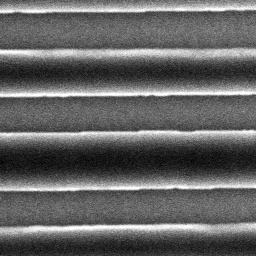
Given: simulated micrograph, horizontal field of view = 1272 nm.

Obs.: lines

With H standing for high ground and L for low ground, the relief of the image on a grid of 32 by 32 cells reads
HHHHHHHHHHHHHHHHHHHHHHHHHHHHHHHH
HHLHHHLLLLLLLLLLLLLLLLLLLLLLLLLL
LLLLLLLLLLLLLLLLLLLLLLLLLLLLLLLL
LLLLLLLLLLLLLLLLLLLLLLLLLLLLLLLL
LLLLLLLLLLLLLLLLLLLLLLLLLLLLLLLL
LLLLLLLLLLLLLLLLLLLLLLLLLLLLLLLL
HHHLLLLHHHLLLLHHHHHHHHHLLLLLHHHH
HHHHHHHHHHHHHHHHHHHHHHHHHHHHHHHH
HHHHHHHHHHHHHHHHHHHHHHHHHHHHHHHH
HHHHHHHHHHHHHHHHHHHHHHHHHHHHHHHH
HHHHHHHHHHHHHHHHHHHHHHHHHHHHHHHH
HHHHHHHHHHHHHHHHHHHHHHHHHHHHHHHH
LLLLLLLLLLLLLLLLLLLLLLLLLLLLLLLL
LLLLLLLLLLLLLLLLLLLLLLLLLLLLLLLL
LLLLLLLLLLLLLLLLLLLLLLLLLLLLLLLL
LLLLLLLLLLLLLLLLLLLLLLLLLLLLLLLL
LLLLLLLLLLLLLLLLLHHHHHHLHHHHHHHH
HHHHHHHHHHHHHHHHHHHHHHHHHHHHHHHH
HHHHHHHHHHHHHHHHHHHHHHHHHHHHHHHH
HHHHHHHHHHHHHHHHHHHHHHHHHHHHHHHH
HHHHHHHHHHHHHHHHHHHHHHHHHHHHHHHH
HHHHHHHHHHHHHHHHHHHHHHHHHHHHHHHH
HHHHHHHHHHHHHHHHHHHHHHHHHHHHHHHH
HHHHHHHHHHHHHHHHHHLLLLLLLLLLLLLL
LLLLLLLLLLLLLLLLLLLLLLLLLLLLLLLL
LLLLLLLLLLLLLLLLLLLLLLLLLLLLLLLL
LLLLLLLLLLLLLLLLLLLLLLLLLLLLLLLL
LLLLLLLLLLLLLLLLLLLLLLLLLLLLLLLL
LLLLHLLLHHHHHHHHHHHHHHHHHHHHHHHH
HHHHHHHHHHHHHHHHHHHHHHHHHHHHHHHH
HHHHHHHHHHHHHHHHHHHHHHHHHHHHHHHH
HHHHHHHHHHHHHHHHHHHHHHHHHHHHHHHH